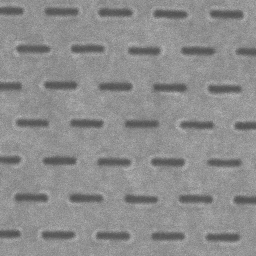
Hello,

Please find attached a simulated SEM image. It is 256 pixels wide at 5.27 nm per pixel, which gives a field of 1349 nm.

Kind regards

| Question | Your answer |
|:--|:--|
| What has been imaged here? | a regular array of holes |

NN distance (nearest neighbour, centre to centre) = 240 nm